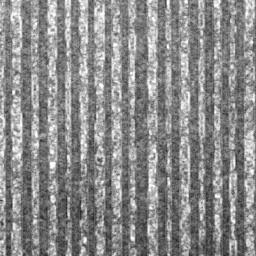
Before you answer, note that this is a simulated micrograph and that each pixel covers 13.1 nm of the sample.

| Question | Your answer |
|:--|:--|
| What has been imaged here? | parallel lines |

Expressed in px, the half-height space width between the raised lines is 7.25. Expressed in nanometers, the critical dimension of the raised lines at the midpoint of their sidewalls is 101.